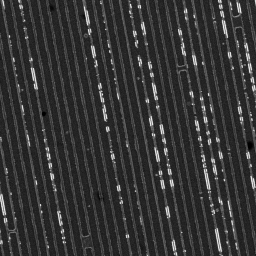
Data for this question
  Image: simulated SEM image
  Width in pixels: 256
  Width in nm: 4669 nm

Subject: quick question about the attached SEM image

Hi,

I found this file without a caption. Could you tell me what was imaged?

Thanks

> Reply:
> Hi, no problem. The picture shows parallel lines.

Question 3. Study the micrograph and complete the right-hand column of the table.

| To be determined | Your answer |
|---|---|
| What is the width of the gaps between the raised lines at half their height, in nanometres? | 130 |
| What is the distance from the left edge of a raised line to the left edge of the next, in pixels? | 8.94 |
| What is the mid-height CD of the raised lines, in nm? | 38.1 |